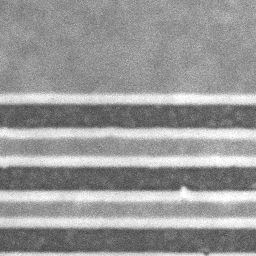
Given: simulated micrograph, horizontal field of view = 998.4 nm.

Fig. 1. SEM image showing one or a few lines or trenches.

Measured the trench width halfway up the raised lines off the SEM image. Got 127 nanometers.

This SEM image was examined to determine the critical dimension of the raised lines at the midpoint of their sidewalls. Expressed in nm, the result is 116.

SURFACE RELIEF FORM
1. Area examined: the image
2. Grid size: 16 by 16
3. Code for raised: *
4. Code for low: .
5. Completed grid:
****************
****************
****************
****************
****************
****************
................
................
****************
****************
................
................
****************
****************
................
................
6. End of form